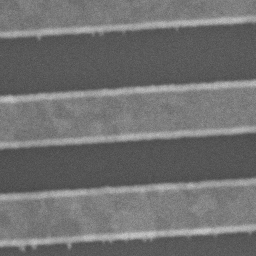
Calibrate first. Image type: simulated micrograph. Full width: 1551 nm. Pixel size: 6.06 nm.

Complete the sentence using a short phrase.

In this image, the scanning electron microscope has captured lines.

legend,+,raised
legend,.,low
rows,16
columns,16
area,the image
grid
++++++++++++++++
++++++++++++....
................
................
................
..........++++++
++++++++++++++++
++++++++++++++++
+++++++++++.....
................
................
............++++
++++++++++++++++
++++++++++++++++
+++++++++++++...
................